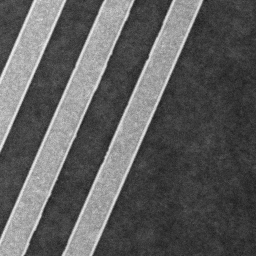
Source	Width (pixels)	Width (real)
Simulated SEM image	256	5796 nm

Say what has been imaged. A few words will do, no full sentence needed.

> one or a few lines or trenches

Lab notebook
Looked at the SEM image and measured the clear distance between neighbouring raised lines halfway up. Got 836 nm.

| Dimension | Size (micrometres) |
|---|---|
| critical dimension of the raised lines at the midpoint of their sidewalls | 0.595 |